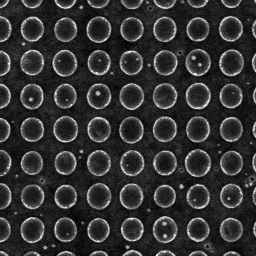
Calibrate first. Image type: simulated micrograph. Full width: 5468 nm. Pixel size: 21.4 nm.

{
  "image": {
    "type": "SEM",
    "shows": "a regular array of raised bodies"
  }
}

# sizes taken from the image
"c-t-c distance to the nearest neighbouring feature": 703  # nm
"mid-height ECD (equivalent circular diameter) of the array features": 0.513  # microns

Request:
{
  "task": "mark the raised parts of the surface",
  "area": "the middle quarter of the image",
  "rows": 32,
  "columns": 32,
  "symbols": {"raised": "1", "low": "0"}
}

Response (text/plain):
11100011111000111110000111110001
11100001111000011110000111100001
11000000110000001100000011000000
00000000000000000000000000000000
00000000000000000000000000000000
11000001110000011100000011100000
11100011111000111110000111110001
11100011111100111111001111110001
11100011111100111111001111110001
11100011111000111111000111110001
11000001110000011110000111100000
00000000000000000000000000000000
00000000000000000000000000000000
11000000110000001100000011000000
11100001111000011110000111110001
11100011111000111111001111110001
11100011111100111111001111110001
11100011111000111111001111110001
11100001111000011110000111100001
00000000000000001100000000000000
00000000000000000000000000000000
00000000000000000000000000000000
11000001111000011110000011100001
11100011111000111111000111110001
11100011111000111111001111110001
11100011111000111111000111110001
11000011111000011110000111100001
00000001110000001100000011000000
00000000000000000000000000000000
00000000000000000000000000000000
10000001110000011100000011000100
11000011111000111110000111100001